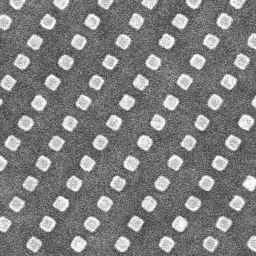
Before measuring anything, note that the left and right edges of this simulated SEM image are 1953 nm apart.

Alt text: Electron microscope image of a regular array of raised bodies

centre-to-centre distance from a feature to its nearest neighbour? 184 nm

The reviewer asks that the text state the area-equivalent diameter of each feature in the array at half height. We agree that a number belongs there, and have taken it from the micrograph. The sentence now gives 0.1 microns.